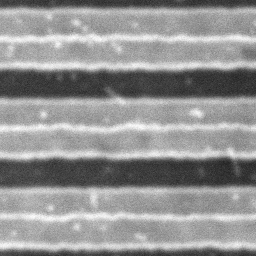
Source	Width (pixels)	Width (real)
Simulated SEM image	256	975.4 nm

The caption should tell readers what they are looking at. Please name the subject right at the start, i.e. lines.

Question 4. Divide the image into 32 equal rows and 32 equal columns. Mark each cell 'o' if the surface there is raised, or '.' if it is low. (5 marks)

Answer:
................................
ooooo.oooooooooooooooooooooooooo
oooooooooooooooooooooooooooooooo
oooooooooooooooooooooooooooooooo
oooooooooooooooooooooooooooooooo
oooooooooooooooooooooooooooooooo
oooooooooooooooooooooooooooooooo
oooooooooooooooooooooooooooooooo
......o....o...o..oo.oo.........
................................
................................
................................
................................
oooooooooooooooooooooooooooooooo
oooooooooooooooooooooooooooooooo
oooooooooooooooooooooooooooooooo
oooooooooooooooooooooooooooooooo
oooooooooooooooooooooooooooooooo
oooooooooooooooooooooooooooooooo
oooooo..oo...ooooooo..oooo...ooo
................................
................................
................................
................................
oooooooooooooooooooooooooooooooo
oooooooooooooooooooooooooooooooo
oooooooooooooooooooooooooooooooo
oooooooooooooooooooooooooooooooo
oooooooooooooooooooooooooooooooo
oooooooooooooooooooooooooooooooo
oooooooooooooooooooooooooooooooo
................................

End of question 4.